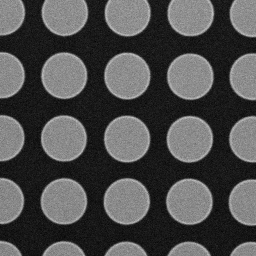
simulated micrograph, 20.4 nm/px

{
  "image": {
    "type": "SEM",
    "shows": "an array of small figures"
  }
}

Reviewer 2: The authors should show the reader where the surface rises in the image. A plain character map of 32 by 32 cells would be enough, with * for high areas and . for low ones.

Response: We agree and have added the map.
***...*****..******..*****...***
***..******..******..******..***
***..******..******..******..***
**....****....****....****...***
...............................*
................................
................................
**....****....****....****....**
***..******..******..*****...***
***..******..******..******..***
***..******..******..******..***
**....****....****....****...***
................................
................................
................................
**....****....****....****...***
***..******..******..*****...***
***..******..******..******..***
***..******..******..*****...***
**....****....****....****....**
................................
................................
*......**......**......*........
**....****....****...*****...***
***..******..******..*****...***
***..******..******..*****...***
***..*****...*****...*****...***
**....****....****....***.....**
................................
................................
*......**......**......**.....**
**....****...*****...*****...***